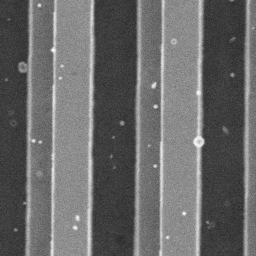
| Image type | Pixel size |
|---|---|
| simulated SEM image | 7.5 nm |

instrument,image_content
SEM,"lines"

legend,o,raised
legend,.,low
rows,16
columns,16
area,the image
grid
..oooo...oooo...
..oooo...ooo....
..oooo...oooo...
..oooo...ooo....
..oooo...ooo....
..oooo...ooo...o
..oooo...ooo...o
..oooo...ooo...o
..oooo...oooo..o
..oooo...ooo...o
..oooo...ooo...o
..oooo...ooo...o
..oooo...ooo...o
..oooo...ooo...o
..oooo...ooo...o
..oooo...ooo...o